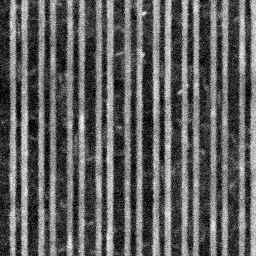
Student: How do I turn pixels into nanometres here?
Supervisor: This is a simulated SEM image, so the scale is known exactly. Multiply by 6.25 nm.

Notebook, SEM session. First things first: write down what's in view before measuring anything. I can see parallel lines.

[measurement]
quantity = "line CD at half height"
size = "28.1 nm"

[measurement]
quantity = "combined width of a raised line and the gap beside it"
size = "0.0892 micrometres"